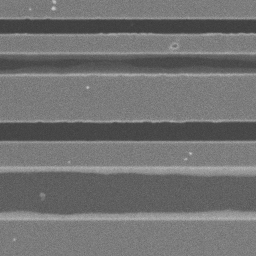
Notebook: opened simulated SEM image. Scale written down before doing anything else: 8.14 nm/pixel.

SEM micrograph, lines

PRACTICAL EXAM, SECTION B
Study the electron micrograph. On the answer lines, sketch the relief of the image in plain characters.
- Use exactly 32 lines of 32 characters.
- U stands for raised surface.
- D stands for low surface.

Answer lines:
UUUUUUUUUUUUUUUUUUUUUUUUUUUUUUUU
UUUUUUUUUUUUUUUUUUUUUUUUUUUUUUUU
DDDDDDDDDDDDDDDDDDDDDDDDDDDDDDDD
DDDDDDDDDDDDDDDDDDDDDDDDDDDDDDDD
UUUUUUUUUUUUUUUUUUUUUUUUUUUUUUUU
UUUUUUUUUUUUUUUUUUUUUUUUUUUUUUUU
UUUUUUUUUUUUUUUUUUUUUUUUUUUUUUUU
DDDDDDDDDDDDDDDDDDDDDDDDDDDDDDDD
DDDDDDDDDDDDDDDDDDDDDDDDDDDDDDDD
UUUUUUUUUUUUUUUUUUUUUUUUUUUUUUUU
UUUUUUUUUUUUUUUUUUUUUUUUUUUUUUUU
UUUUUUUUUUUUUUUUUUUUUUUUUUUUUUUU
UUUUUUUUUUUUUUUUUUUUUUUUUUUUUUUU
UUUUUUUUUUUUUUUUUUUUUUUUUUUUUUUU
UUUUUUUUUUUUUUUUUUUUUUUUUUUUUUUU
DDDDDDDDDDDDDDDDDDDDDDDDDDDDDDDD
DDDDDDDDDDDDDDDDDDDDDDDDDDDDDDDD
DDDDDDDDDDDDDDDDDDDDDDDDDDDDDDDD
UUUUUUUUUUUUUUUUUUUUUUUUUUUUUUUU
UUUUUUUUUUUUUUUUUUUUUUUUUUUUUUUU
UUUUUUUUUUUUUUUUUUUUUUUUUUUUUUUU
DDDDDDDDDDDDDDDDDDDDDDDDDDDDDDDD
DDDDDDDDDDDDDDDDDDDDDDDDDDDDDDDD
DDDDDDDDDDDDDDDDDDDDDDDDDDDDDDDD
DDDDDDDDDDDDDDDDDDDDDDDDDDDDDDDD
DDDDDDDDDDDDDDDDDDDDDDDDDDDDDDDD
DDDDDDDDDDDDDDDDDDDDDDDDDDDDDDDD
UUUUUUUUUUUUUUUUUUUUUUUUUUUUUUUU
UUUUUUUUUUUUUUUUUUUUUUUUUUUUUUUU
UUUUUUUUUUUUUUUUUUUUUUUUUUUUUUUU
UUUUUUUUUUUUUUUUUUUUUUUUUUUUUUUU
UUUUUUUUUUUUUUUUUUUUUUUUUUUUUUUU